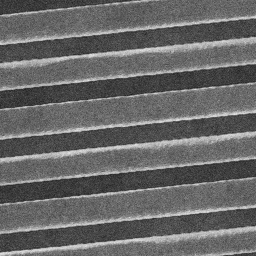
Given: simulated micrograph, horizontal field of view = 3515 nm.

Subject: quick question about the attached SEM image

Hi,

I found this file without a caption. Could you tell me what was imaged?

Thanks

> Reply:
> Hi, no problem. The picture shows lines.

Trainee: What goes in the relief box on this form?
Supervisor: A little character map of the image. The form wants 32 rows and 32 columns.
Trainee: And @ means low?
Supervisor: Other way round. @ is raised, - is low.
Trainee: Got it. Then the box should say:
--------------@@@@@@@@@@@@@@@@@@
-----@@@@@@@@@@@@@@@@@@@@@@@@@@@
@@@@@@@@@@@@@@@@@@@@@@@@@@@@@---
@@@@@@@@@@@@@@@@@@@-------------
@@@@@@@@@@----------------------
@-------------------------@@@@@@
----------------@@@@@@@@@@@@@@@@
------@@@@@@@@@@@@@@@@@@@@@@@@@@
@@@@@@@@@@@@@@@@@@@@@@@@@@------
@@@@@@@@@@@@@@@@@---------------
@@@@@@@@-----------------------@
---------------------@@@@@@@@@@@
-----------@@@@@@@@@@@@@@@@@@@@@
--@@@@@@@@@@@@@@@@@@@@@@@@@@@@@@
@@@@@@@@@@@@@@@@@@@@@@@@@@@-----
@@@@@@@@@@@@@@@@@@--------------
@@@@@@@@@-----------------------
-------------------------@@@@@@@
-------------@@@@@@@@@@@@@@@@@@@
----@@@@@@@@@@@@@@@@@@@@@@@@@@@@
@@@@@@@@@@@@@@@@@@@@@@@@@@------
@@@@@@@@@@@@@@@@----------------
@@@@@@@-----------------------@@
-------------------@@@@@@@@@@@@@
----------@@@@@@@@@@@@@@@@@@@@@@
@@@@@@@@@@@@@@@@@@@@@@@@@@@@@@@@
@@@@@@@@@@@@@@@@@@@@@@@@@@------
@@@@@@@@@@@@@@@@@---------------
@@@@@@-------------------------@
----------------------@@@@@@@@@@
-----------@@@@@@@@@@@@@@@@@@@@@
--@@@@@@@@@@@@@@@@@@@@@@@@@@@@@@